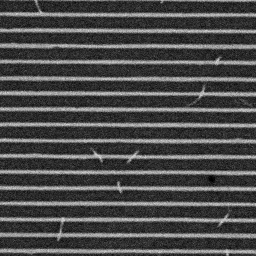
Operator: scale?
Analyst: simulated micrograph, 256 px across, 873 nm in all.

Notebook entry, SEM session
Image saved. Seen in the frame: parallel lines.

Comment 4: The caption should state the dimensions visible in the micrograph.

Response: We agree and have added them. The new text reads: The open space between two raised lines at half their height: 40.5 nanometres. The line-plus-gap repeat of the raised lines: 0.0538 microns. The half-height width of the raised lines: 11.5 nanometres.